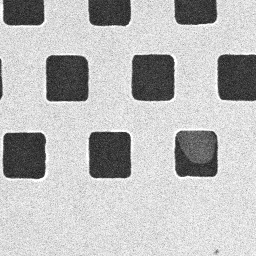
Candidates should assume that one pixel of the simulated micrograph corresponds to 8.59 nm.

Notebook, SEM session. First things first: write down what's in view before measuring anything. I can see holes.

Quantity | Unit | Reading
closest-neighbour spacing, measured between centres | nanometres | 737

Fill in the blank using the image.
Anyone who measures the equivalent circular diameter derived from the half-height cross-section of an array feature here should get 49.8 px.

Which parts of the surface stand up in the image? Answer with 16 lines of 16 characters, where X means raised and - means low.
---XXX--XXX---XX
X-XXXX--XXX--XXX
XXXXXXXXXXXXXXXX
XXX--XXXX--XXX--
XXX---XX---XXX--
XXX---XX---XXX--
XXXXXXXXXXXXXXXX
XXXXXXXXXXXXXXXX
---XXX--XXX--XXX
---XXX--XXX---XX
---XXX--XXX---XX
XXXXXXXXXXXXXXXX
XXXXXXXXXXXXXXXX
XXXXXXXXXXXXXXXX
XXXXXXXXXXXXXXXX
XXXXXXXXXXXXXXXX